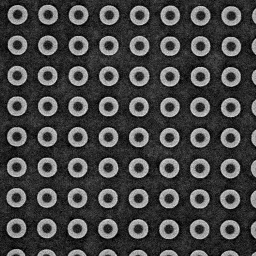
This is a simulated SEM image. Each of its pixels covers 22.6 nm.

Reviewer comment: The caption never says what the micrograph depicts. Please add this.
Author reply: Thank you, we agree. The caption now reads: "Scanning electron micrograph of an array of small figures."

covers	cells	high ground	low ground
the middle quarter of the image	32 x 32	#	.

................................
..###....####....####....###....
.#####...#####...####...#####...
.#####...#####...####...#####...
..###....####....####...####....
................................
................................
................................
..###.....##......##............
.#####...####....####....####...
.#####...####...#####...#####...
.#####...####...#####...#####...
..###.....###....###.....###....
................................
................................
................................
..###.....###....###.....###....
.#####...####....####...#####...
.#####...####...#####...#####...
.#####...####....####...#####...
...#......##......##.....###....
................................
................................
................................
.####....####....###....####....
.#####...####...#####...#####...
.#####...####...#####...#####...
..###....####....####...####....
................................
................................
................................
..###.....##......##.....##.....